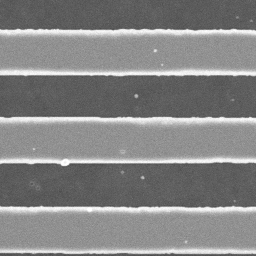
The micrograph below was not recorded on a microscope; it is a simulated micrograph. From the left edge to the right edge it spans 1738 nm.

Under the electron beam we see lines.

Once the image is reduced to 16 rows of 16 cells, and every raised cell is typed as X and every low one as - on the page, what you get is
----------------
----------------
XXXXXXXXXXXXXXXX
XXXXXXXXXXXXXXXX
XXXXXXXXXXXXXXXX
----------------
----------------
XXXXXXXXXXXXXXXX
XXXXXXXXXXXXXXXX
XXXXXXXXXXXXXXXX
----------------
----------------
----------------
XXXXXXXXXXXXXXXX
XXXXXXXXXXXXXXXX
XXXXXXXXXXXXXXXX